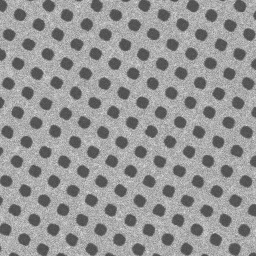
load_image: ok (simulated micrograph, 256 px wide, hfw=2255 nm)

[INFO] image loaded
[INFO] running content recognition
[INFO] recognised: a regular array of holes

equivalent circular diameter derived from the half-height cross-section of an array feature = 110 nanometers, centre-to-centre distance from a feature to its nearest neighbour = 0.186 micrometres